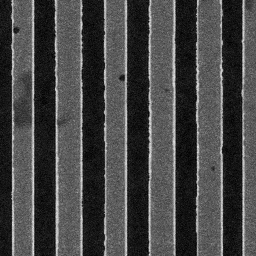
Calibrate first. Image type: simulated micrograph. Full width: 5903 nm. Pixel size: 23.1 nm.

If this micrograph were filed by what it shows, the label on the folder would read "lines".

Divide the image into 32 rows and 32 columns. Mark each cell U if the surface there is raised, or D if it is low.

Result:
DDUUDDDUUUDDDUUUDDDUUUDDDUUUDDUU
DDUUDDDUUUDDDUUUDDDUUUDDDUUUDDUU
DDUUDDDUUUDDDUUUDDDUUUDDDUUUDDUU
DDUUDDDUUUDDDUUUDDDUUUDDDUUUDDUU
DDUUDDDUUUDDDUUUDDDUUUDDDUUUDDUU
DDUUDDDUUUDDDUUUDDDUUUDDDUUUDDUU
DDUUDDDUUUDDDUUUDDDUUUDDDUUUDDUU
DDUUDDDUUUDDDUUUDDDUUUDDDUUUDDUU
DDUUDDDUUUDDDUUUDDDUUUDDDUUUDDUU
DDUUDDDUUUDDDUUUDDDUUUDDDUUUDDUU
DDUUDDDUUUDDDUUUDDDUUUDDDUUUDDUU
DDUUDDDUUUDDDUUUDDDUUUDDDUUUDDUU
DDUUDDDUUUDDDUUUDDDUUUDDDUUUDDUU
DDUUDDDUUUDDDUUUDDDUUUDDDUUUDDUU
DDUUDDDUUUDDDUUUDDDUUUDDDUUUDDUU
DDUUDDDUUUDDDUUUDDDUUUDDDUUUDDUU
DDUUDDDUUUDDDUUUDDDUUUDDDUUUDDUU
DDUUDDDUUUDDDUUUDDDUUUDDDUUUDDUU
DDUUDDDUUUDDDUUUDDDUUUDDDUUUDDUU
DDUUDDDUUUDDDUUUDDDUUUDDDUUUDDUU
DDUUDDDUUUDDDUUUDDDUUUDDDUUUDDUU
DDUUDDDUUUDDDUUUDDDUUUDDDUUUDDUU
DDUUDDDUUUDDDUUUDDDUUUDDDUUUDDUU
DDUUDDDUUUDDDUUUDDDUUUDDDUUUDDUU
DDUUDDDUUUDDDUUUDDDUUUDDDUUUDDUU
DDUUDDDUUUDDDUUUDDDUUUDDDUUUDDUU
DDUUDDDUUUDDDUUUDDDUUUDDDUUUDDUU
DDUUDDDUUUDDDUUUDDDUUUDDDUUUDDUU
DDUUDDDUUUDDDUUUDDDUUUDDDUUUDDUU
DDUUDDDUUUDDDUUUDDDUUUDDDUUUDDUU
DDUUDDDUUUDDDUUUDDDUUUDDDUUUDDUU
DDUUDDDUUUDDDUUUDDDUUUDDDUUUDDUU